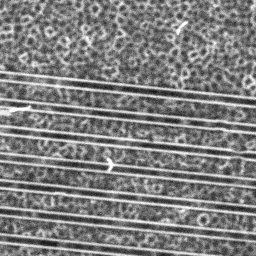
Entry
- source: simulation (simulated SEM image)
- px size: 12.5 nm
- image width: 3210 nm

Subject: parallel lines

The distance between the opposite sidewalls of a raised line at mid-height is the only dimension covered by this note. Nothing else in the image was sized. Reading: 108 nm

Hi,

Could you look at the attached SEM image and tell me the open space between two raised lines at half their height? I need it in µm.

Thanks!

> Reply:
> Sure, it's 0.226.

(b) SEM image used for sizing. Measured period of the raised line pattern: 337 nanometres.